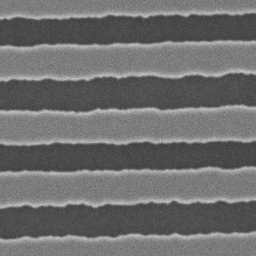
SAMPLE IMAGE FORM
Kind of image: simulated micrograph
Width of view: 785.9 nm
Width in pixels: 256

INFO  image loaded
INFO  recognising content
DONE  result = lines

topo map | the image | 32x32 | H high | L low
HHHHHHHHHHHHHHHHHHHHHHHHHHHHHHHH
HHHHHHHHHHHHHHHHHHHHHHHHHHHHHHHH
LLLLLLLLLLLLLLLLLLLLLLLLLLLLLLLL
LLLLLLLLLLLLLLLLLLLLLLLLLLLLLLLL
LLLLLLLLLLLLLLLLLLLLLLLLLLLLLLLL
LLLLLLLLLLLLLLHHHHLHHHHHHHHHHHHH
HHHHHHHHHHHHHHHHHHHHHHHHHHHHHHHH
HHHHHHHHHHHHHHHHHHHHHHHHHHHHHHHH
HHHHHHHHHHHHHHHHHHHHHHHHHHHHHHHH
HHHHHHHHHHHHHHHHLHLHHHHLLHHHLLLL
LLLLLLLLLLLLLLLLLLLLLLLLLLLLLLLL
LLLLLLLLLLLLLLLLLLLLLLLLLLLLLLLL
LLLLLLLLLLLLLLLLLLLLLLLLLLLLLLLL
LLLLLLLLLLLLLLLLLLLLLLLLLHLHHHHH
HHHHHHHHHHHHHHHHHHHHHHHHHHHHHHHH
HHHHHHHHHHHHHHHHHHHHHHHHHHHHHHHH
HHHHHHHHHHHHHHHHHHHHHHHHHHHHHHHH
HHHHHHHHHHHHHHHHHHHHHHHHHHHHHHHH
LLLLLLLLLLLLLLLLLLLLLLLLLLLLLLLL
LLLLLLLLLLLLLLLLLLLLLLLLLLLLLLLL
LLLLLLLLLLLLLLLLLLLLLLLLLLLLLLLL
HHHHHHHLLHHHHHHHHHHHHHHHHHHHHHHH
HHHHHHHHHHHHHHHHHHHHHHHHHHHHHHHH
HHHHHHHHHHHHHHHHHHHHHHHHHHHHHHHH
HHHHHHHHHHHHHHHHHHHHHHHHHHHHHHHH
HHHHHHHHHHHHHHHHHLLLLLLLLLLLLLLL
LLLLLLLLLLLLLLLLLLLLLLLLLLLLLLLL
LLLLLLLLLLLLLLLLLLLLLLLLLLLLLLLL
LLLLLLLLLLLLLLLLLLLLLLLLLLLLLLLL
LLLLLLLLLLLLLLLHHHHHHHHHHHHHHHHH
HHHHHHHHHHHHHHHHHHHHHHHHHHHHHHHH
HHHHHHHHHHHHHHHHHHHHHHHHHHHHHHHH